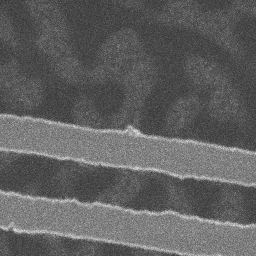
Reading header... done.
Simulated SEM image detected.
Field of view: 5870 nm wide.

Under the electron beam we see one or a few lines or trenches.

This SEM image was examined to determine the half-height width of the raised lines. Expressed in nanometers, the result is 790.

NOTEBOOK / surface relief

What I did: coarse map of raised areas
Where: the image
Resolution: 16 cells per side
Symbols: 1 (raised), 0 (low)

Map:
0000000000000000
0000000000000000
0000000000000000
0000000000000000
0000000000000000
0000000000000000
0000000000000000
1110000000000000
1111111110000000
0111111111111111
0000000011111111
0000000000000001
1110000000000000
1111111111110000
0111111111111111
0000000001111111